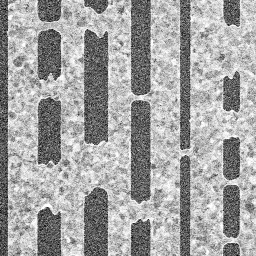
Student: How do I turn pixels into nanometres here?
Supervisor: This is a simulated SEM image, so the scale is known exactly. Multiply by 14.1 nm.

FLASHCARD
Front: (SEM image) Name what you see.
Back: parallel lines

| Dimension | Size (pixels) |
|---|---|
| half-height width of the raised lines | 24.5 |